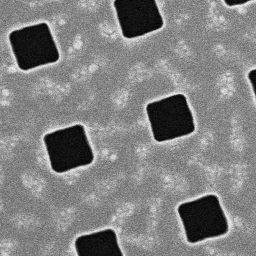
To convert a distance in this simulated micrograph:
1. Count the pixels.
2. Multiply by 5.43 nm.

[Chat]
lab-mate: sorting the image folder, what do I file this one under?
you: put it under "holes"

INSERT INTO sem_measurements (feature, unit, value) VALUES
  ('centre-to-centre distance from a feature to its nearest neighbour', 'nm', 576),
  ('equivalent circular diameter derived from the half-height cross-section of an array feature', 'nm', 250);